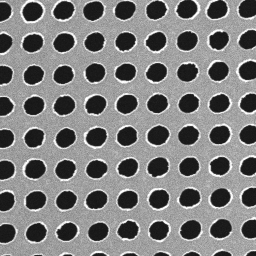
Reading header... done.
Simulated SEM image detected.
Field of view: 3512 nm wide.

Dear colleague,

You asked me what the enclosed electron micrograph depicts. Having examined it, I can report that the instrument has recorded a regular array of holes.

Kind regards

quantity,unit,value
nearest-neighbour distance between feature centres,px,30.6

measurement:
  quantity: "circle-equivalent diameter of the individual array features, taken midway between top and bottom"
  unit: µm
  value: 0.269